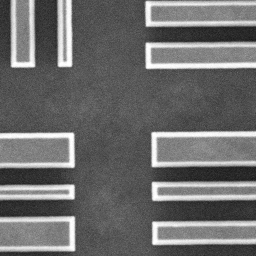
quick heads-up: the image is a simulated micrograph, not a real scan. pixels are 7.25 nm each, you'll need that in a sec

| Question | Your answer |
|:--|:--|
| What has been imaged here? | groups of lines, slits or small figures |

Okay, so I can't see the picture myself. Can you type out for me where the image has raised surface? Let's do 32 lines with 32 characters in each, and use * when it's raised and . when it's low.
..**....*..........*************
..**....*..........*************
..**....*..........*************
..**....*.......................
..**....*.......................
..**....*.......................
..**....*..........*************
..**....*..........*************
................................
................................
................................
................................
................................
................................
................................
................................
................................
*********..........*************
*********..........*************
*********..........*************
*********...........********....
................................
................................
*********..........*************
*********..........*************
................................
................................
*********.......................
*********..........*************
*********..........*************
*********.......................
................................